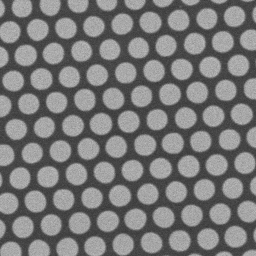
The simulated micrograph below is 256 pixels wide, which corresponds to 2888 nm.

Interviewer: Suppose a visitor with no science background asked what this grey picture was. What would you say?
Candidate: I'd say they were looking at an array of small figures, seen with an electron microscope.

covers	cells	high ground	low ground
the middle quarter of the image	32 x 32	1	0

00000001100000111000111110011111
11100011110001111100111110011111
11110011111001111100111110011111
11110011111001111100011110001110
11110011110000111000000000000000
11100000000000000000000001110001
00001100000111000111100011111001
00011110001111100111110011111001
00011111001111100111110011111001
10011111001111100111110001110000
10011110000111000011000000000000
00001100000000000000000100000111
00000000110000111100011110001111
01110001111000111110011111001111
11111001111100111110011111001111
11111001111100111110011110000111
11111001111000111100000000000000
01110000110000000000000000110000
00000000000011100011110001111100
00001111000111100011111001111100
10001111100111110011111001111100
11001111100111110011111001111000
11001111000111100001110000000000
10000110000000000000000000000011
00000000000000001110001111000111
01111000111100011110001111100111
01111000111110011111011111100111
01111100111110011111001111000111
01111100111100011110000110000000
01111000011100000000000000011000
00000000000001100000111000111100
10000111000011110001111000111110